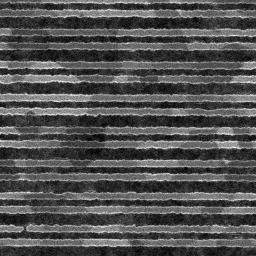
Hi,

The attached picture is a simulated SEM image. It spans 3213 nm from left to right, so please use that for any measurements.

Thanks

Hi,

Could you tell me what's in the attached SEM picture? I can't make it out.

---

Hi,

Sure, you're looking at parallel lines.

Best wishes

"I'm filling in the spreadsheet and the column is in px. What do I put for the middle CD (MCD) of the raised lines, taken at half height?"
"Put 6.88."